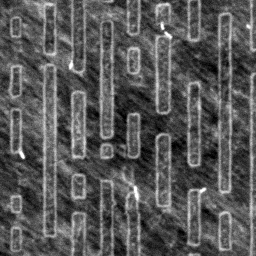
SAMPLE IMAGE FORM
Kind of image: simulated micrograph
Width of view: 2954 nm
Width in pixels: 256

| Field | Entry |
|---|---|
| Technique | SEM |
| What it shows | parallel lines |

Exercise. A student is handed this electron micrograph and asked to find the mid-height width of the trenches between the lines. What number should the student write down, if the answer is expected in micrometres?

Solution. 0.221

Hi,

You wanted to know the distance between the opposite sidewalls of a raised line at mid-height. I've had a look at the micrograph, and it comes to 133 nm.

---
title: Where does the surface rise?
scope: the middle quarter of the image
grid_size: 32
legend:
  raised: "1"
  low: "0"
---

00111000001100001110000111000000
00111000011100001110000111000000
00000000011100000000000111000000
00000000011100000000000111000000
00000000011100000000000111000000
00000000011100000000000111000001
00000000011100000000000111000001
00111000011100000000000111000001
00111000011100000000000111000001
00111000011100000000000111000001
00111000011100000000000111000001
00111000011100000000000111000001
00111000011100000000000000000001
00111000011100001110000000000001
00111000011100001110000000000001
00111000011100001110000000000001
00111000011100001110000000000001
00111000011100001110000000000001
00111000001000001110000111000001
00111000000000001110000111000001
00111000001100001110000111000001
00111000011100101110000111000001
00111000011100101110000111000001
00000000000000000000000111000001
00000000000000000000000111000001
00000000000000000000000111000000
00000000000000011000000111000000
00000000000000011000000111000000
00111000000000000000000111000000
00111000001100000000000111000000
00111000011100000000000111000000
00111000011100000000000111000000